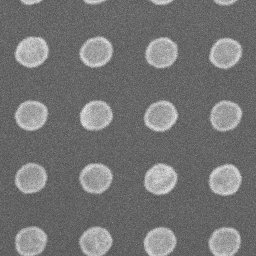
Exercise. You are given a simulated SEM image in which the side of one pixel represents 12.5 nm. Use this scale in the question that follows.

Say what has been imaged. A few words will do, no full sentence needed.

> a regular array of raised bodies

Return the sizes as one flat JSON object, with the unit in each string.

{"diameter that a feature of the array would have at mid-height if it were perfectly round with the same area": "365 nanometers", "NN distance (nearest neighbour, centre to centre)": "789 nanometers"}